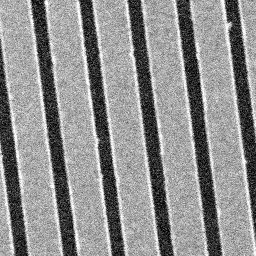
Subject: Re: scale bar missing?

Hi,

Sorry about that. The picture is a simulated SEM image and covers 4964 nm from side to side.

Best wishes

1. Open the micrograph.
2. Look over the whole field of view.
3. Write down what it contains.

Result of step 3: parallel lines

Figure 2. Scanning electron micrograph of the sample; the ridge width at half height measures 627 nm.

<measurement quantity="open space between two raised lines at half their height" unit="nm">303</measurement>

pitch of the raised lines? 931 nm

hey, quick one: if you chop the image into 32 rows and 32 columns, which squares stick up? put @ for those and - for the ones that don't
@@@@--@@@@--@@@@--@@@@--@@@@--@@
@@@@--@@@@--@@@@--@@@@--@@@@--@@
@@@@--@@@@--@@@@--@@@@--@@@@--@@
@@@@--@@@@--@@@@--@@@@--@@@@--@@
@@@@--@@@@--@@@@--@@@@--@@@@--@@
@@@@--@@@@--@@@@@-@@@@@--@@@@--@
@@@@--@@@@---@@@@--@@@@--@@@@--@
-@@@@--@@@@--@@@@--@@@@--@@@@--@
-@@@@--@@@@--@@@@--@@@@--@@@@--@
-@@@@--@@@@--@@@@--@@@@--@@@@--@
-@@@@--@@@@--@@@@--@@@@--@@@@--@
-@@@@--@@@@--@@@@--@@@@--@@@@--@
-@@@@--@@@@--@@@@--@@@@--@@@@--@
-@@@@--@@@@--@@@@--@@@@@--@@@@--
-@@@@--@@@@@-@@@@@--@@@@--@@@@--
--@@@@--@@@@--@@@@--@@@@--@@@@--
--@@@@--@@@@--@@@@--@@@@--@@@@--
--@@@@--@@@@--@@@@--@@@@--@@@@--
--@@@@--@@@@--@@@@--@@@@--@@@@--
--@@@@--@@@@--@@@@--@@@@--@@@@--
--@@@@--@@@@--@@@@--@@@@--@@@@@-
--@@@@--@@@@@-@@@@@--@@@@--@@@@-
--@@@@@--@@@@--@@@@--@@@@--@@@@-
@--@@@@--@@@@--@@@@--@@@@--@@@@-
@--@@@@--@@@@--@@@@--@@@@--@@@@-
@--@@@@--@@@@--@@@@--@@@@--@@@@-
@--@@@@--@@@@--@@@@--@@@@--@@@@-
@--@@@@--@@@@--@@@@--@@@@--@@@@-
@--@@@@--@@@@--@@@@--@@@@--@@@@@
@--@@@@---@@@--@@@@@-@@@@@--@@@@
@--@@@@@--@@@@--@@@@--@@@@--@@@@
@@--@@@@--@@@@--@@@@--@@@@--@@@@